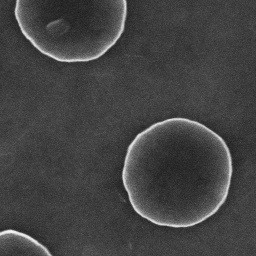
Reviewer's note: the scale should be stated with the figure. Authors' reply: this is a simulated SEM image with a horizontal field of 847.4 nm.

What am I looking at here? raised bodies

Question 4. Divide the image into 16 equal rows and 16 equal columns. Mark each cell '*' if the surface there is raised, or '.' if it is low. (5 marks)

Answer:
.*******........
.*******........
..*****.........
...***..........
................
................
................
..........**....
.........*****..
........******..
........******..
........******..
........******..
.........****...
*...............
***.............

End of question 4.